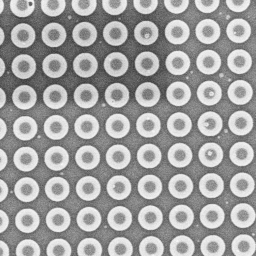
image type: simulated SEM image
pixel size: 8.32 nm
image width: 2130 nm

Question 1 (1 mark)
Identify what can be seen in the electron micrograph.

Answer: an array of small figures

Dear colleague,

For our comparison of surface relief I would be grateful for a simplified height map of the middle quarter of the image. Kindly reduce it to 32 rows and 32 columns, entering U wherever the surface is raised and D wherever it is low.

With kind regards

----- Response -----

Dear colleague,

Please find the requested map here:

UDUUUUUUDDUUUUUUDDUUUUUUDDUUUUUD
DDDUUUUUDDUUUUUUDDUUUUUDDDUUUUUD
DDDUUUUDDDDUUUUDDDDUUUDDDDDUUUDD
DDDDDDDDDDDDDDDDDDDDDDDDDDDDDDDD
DDDDDDDDDDDDDDDDDDDDDDDDDDDDDDDD
DDDDUUUDDDDUUUUDDDDUUUUDDDUUUUUD
DDDUUUUUDDDUUUUUDDUUUUUUDDUUUUUD
UDDUUUUUDDUUUUUUDDUUUUUUDDUUUUUU
UDDUUUUUDDUUUUUUDDUUUUUUDDUUUUUD
DDDUUUUUDDDUUUUUDDDUUUUDDDUUUUUD
DDDDUUUDDDDDUUDDDDDDUUDDDDDDDDDD
DDDDDDDDDDDDDDDDDDDDDDDDDDDDDDDD
DDDDDDDDDDDDDDDDDDDDUUDDDDDUUUDD
DDDDUUUUDDDUUUUUDDDUUUUDDDUUUUUD
UDDUUUUUDDDUUUUUDDUUUUUUDDUUUUUU
UDDUUUUUUDDUUUUUDDUUUUUUDDUUUUUU
UDDUUUUUUDDUUUUUDDUUUUUUDDUUUUUD
UDDUUUUUDDDUUUUUDDDUUUUDDDDUUUUD
DDDDDUUDDDDDDDDDDDDDDDDDDDDDDDDD
DDDDDDDDDDDDDDDDDDDDDDDDDDDDDDDD
DDDDDDDDDDDDUUUDDDDDUUUDDDDUUUUD
DDDDUUUUDDDUUUUUDDDUUUUUDDUUUUUU
UDDUUUUUUDDUUUUUDDUUUUUUDDUUUUUU
UDDUUUUUUDDUUUUUDDUUUUUUDDUUUUUU
UDDUUUUUUDDUUUUUDDDUUUUUDDDUUUUD
DDDDUUUUDDDUUUUUDDDDUUUDDDDDUUDD
DDDDDDDDDDDDDDDDDDDDDDDDDDDDDDDD
DDDDDDDDDDDDDDDDDDDDDDDDDDDDDDDD
DDDDDUUDDDDDUUUUDDDUUUUDDDDUUUUD
UDDDUUUUUDDUUUUUDDDUUUUUDDUUUUUU
UDDUUUUUUDDUUUUUUDDUUUUUDDUUUUUU
UDDUUUUUUDDUUUUUUDDUUUUUDDUUUUUU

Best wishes